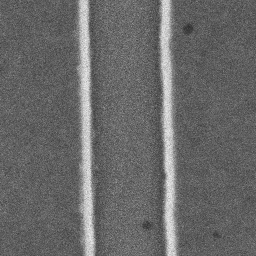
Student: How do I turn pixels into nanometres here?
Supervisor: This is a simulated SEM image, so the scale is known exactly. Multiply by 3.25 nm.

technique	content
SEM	one or a few lines or trenches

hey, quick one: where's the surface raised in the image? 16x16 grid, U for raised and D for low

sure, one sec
UUUUUDDDDDUUUUUU
UUUUUDDDDDUUUUUU
UUUUUDDDDDUUUUUU
UUUUUDDDDDUUUUUU
UUUUUDDDDDUUUUUU
UUUUUDDDDDUUUUUU
UUUUUDDDDDUUUUUU
UUUUUDDDDDUUUUUU
UUUUUDDDDDDUUUUU
UUUUUDDDDDDUUUUU
UUUUUDDDDDDUUUUU
UUUUUDDDDDDUUUUU
UUUUUDDDDDDUUUUU
UUUUUUDDDDDUUUUU
UUUUUUDDDDDUUUUU
UUUUUUDDDDDUUUUU